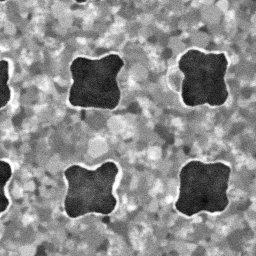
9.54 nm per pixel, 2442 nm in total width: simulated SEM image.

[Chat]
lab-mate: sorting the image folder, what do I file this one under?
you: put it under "holes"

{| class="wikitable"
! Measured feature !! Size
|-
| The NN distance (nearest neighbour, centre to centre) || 1030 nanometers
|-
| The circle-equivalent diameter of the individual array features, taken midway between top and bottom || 538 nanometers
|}